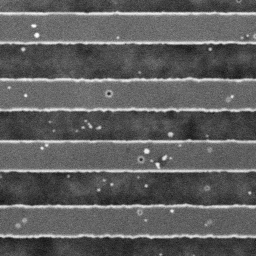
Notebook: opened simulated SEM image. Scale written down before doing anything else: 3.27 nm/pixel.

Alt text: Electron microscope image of lines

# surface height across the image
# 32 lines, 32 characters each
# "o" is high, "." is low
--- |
................................
................................
oooooooooooooooooooooooooooooooo
oooooooooooooooooooooooooooooooo
oooooooooooooooooooooooooooooooo
................................
................................
................................
................................
................................
oooooooooooooooooooooooooooooooo
oooooooooooooooooooooooooooooooo
oooooooooooooooooooooooooooooooo
oooooooooooooooooooooooooooooooo
................................
................................
................................
................................
oooooooooooooooooooooooooooooooo
oooooooooooooooooooooooooooooooo
oooooooooooooooooooooooooooooooo
................................
................................
................................
................................
................................
oooooooooooooooooooooooooooooooo
oooooooooooooooooooooooooooooooo
oooooooooooooooooooooooooooooooo
oooooooooooooooooooooooooooooooo
................................
................................